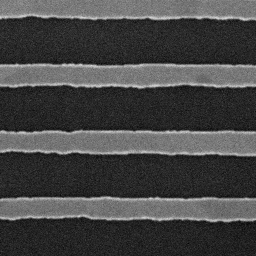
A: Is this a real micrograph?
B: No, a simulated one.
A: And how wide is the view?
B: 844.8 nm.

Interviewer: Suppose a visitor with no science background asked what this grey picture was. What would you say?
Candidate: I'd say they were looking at lines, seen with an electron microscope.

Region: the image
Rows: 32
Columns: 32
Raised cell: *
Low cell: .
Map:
********************************
********************************
..............................*.
................................
................................
................................
................................
................................
********************************
********************************
********************************
................................
................................
................................
................................
................................
*....***.**********..***....**..
********************************
********************************
................................
................................
................................
................................
................................
................................
********************************
********************************
.........................*******
................................
................................
................................
................................